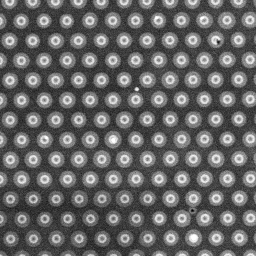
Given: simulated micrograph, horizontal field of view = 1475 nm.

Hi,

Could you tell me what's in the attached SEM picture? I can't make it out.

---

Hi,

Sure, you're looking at an array of small figures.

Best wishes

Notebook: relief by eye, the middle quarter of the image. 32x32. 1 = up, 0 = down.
11000111000111000110001110001110
00000000000000000000000000000000
00111000111000110001110001110001
00111000111001111001111011111011
00111100111001111001111011111011
00111000111000110000110001110001
00000000000000000000000000000000
11000111000110000110001110001110
11100111001111001111001111011110
11100111001111001111001111001110
11000111000110000110000110001100
00000000000000000000000000000000
00111000111000111001110001110001
00111100111001111001111001110011
00111100111001111001111001110011
00011000111000111000110000110001
00000000000000000000000000000000
11000111000111000110000110001110
11100111101111001111001111011111
11100111101111001111001111001110
11000111000111000110000110001110
00000000000000000000000000000000
00111000111001111001110001110001
00111101111101111001111001111011
00111101111101111001111001110001
00011000111000110000110000100001
00000000000000000000000000000000
11000111000111001110001110001110
11100111101111001111001111001110
11100111001111001111001111001110
11000111000111000110000110000100
00000000000000000000000000000000